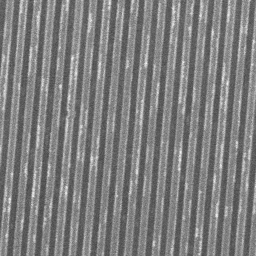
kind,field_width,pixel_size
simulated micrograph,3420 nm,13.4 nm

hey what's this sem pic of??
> parallel lines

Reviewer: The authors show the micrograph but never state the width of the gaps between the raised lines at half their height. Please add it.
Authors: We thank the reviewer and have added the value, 89.9 nanometers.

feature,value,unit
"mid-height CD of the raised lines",89.9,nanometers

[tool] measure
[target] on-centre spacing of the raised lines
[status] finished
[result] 0.185 microns